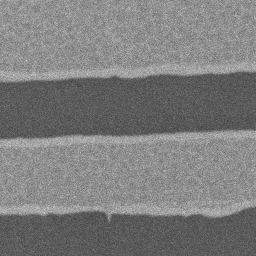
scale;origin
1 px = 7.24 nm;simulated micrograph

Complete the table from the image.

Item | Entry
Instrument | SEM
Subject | one or a few lines or trenches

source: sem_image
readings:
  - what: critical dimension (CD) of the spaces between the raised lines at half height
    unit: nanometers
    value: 477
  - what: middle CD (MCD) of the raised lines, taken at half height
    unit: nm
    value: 511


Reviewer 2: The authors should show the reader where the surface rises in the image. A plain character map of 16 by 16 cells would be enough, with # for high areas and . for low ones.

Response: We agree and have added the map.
################
################
################
################
#########.......
................
................
................
.............###
################
################
################
################
................
................
................